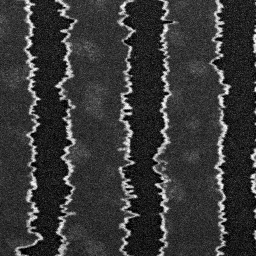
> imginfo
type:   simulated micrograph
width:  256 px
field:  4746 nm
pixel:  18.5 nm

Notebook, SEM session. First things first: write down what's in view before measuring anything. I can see one or a few lines or trenches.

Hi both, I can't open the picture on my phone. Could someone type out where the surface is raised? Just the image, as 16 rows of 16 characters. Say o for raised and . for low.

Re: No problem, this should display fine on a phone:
oo..oooo..oooo..
oo..oooo..oooo..
oo..oooo..oooo..
oo..oooo..oooo..
oo..oooo..oooo..
oo..oooo..oooo..
oo..oooo..oooo..
oo..oooo..oooo..
oo..oooo..oooo..
oo..oooo..oooo..
oo..oooo..oooo..
oo..oooo..oooo..
oo..oooo..oooo..
oo..oooo..oooo..
oo..oooo..oooo..
oo..oooo..oooo..